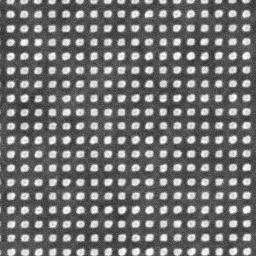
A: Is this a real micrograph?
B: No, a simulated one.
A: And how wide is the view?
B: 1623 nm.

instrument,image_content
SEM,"a regular array of raised bodies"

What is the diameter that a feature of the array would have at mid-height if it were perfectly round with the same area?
42.3 nm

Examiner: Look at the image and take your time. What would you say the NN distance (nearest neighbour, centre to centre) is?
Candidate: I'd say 85.4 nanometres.